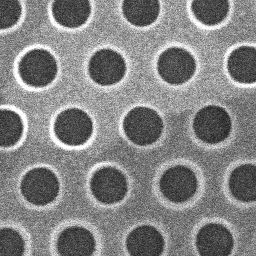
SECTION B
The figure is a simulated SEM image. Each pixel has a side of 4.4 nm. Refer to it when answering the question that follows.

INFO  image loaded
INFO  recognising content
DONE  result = a regular array of holes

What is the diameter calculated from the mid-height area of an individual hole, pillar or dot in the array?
0.173 microns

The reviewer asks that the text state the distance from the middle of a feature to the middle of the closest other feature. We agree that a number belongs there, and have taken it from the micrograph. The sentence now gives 0.3 microns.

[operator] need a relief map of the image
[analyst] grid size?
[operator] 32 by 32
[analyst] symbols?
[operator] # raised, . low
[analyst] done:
...####....####.....####.....###
...####....####.....####.....###
..#####....#####...######...####
.#######..######################
################################
################################
###...######...#####....#####...
##.....####.....####....####....
##.....####.....####.....###....
##.....####.....####....#####...
###...######..#######..#########
################################
################################
#########.#######..######...####
..#####....#####....####.....###
...####.....###.....####.....###
...####.....####....####.....###
..#####....#####....#####...####
.###############################
################################
################################
###....#####...#####....#####...
###....####.....####.....####...
##.....####.....####.....####...
###....#####....####....#####...
####..#######.########.#########
################################
################################
..######...######...#####...####
...####.....####....####.....###
...####.....####.....###.....###
...####.....####....#####....###